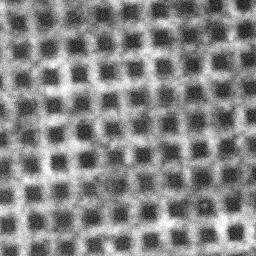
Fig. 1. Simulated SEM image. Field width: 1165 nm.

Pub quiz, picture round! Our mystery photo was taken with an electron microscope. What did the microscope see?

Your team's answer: a regular array of raised bodies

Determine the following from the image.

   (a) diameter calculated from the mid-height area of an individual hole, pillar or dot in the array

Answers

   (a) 85.1 nm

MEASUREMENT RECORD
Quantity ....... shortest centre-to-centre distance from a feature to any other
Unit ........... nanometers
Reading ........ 127